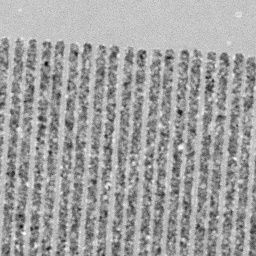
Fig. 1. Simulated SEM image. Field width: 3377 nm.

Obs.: parallel lines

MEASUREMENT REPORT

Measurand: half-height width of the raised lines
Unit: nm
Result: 138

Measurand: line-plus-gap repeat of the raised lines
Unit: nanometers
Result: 181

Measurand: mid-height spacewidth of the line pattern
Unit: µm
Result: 0.0493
